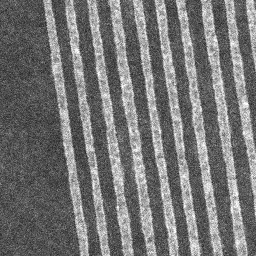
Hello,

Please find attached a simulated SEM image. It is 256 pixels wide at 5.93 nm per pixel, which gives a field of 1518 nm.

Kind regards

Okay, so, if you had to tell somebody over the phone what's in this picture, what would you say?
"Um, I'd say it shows parallel lines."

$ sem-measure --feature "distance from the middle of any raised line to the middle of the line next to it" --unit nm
132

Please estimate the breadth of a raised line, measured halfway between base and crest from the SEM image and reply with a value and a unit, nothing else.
7.67 pixels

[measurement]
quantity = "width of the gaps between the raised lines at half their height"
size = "0.0821 µm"